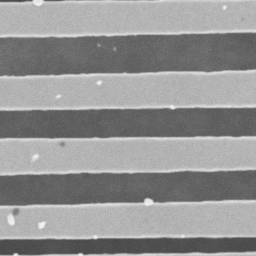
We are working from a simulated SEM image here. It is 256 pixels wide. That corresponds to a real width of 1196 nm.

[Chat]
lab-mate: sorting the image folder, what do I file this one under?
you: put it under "lines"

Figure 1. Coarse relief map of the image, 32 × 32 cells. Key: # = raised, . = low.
################################
################################
################################
################################
######.###......................
................................
................................
................................
................................
##.#############################
################################
################################
################################
###################..#..........
................................
................................
................................
################################
################################
################################
################################
######################..........
................................
................................
................................
...........#####################
################################
################################
################################
################################
................................
................................